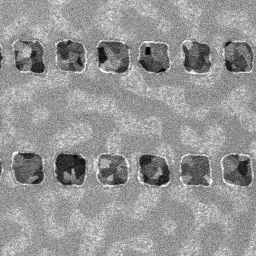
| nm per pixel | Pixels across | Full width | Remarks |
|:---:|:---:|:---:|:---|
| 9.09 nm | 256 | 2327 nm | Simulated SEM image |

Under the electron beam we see a regular array of raised bodies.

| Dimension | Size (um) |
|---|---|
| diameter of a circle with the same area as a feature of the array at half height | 0.308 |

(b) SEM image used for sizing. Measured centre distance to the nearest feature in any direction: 379 nanometers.